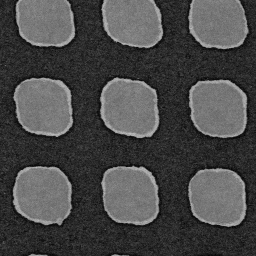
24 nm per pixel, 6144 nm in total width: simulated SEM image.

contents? raised bodies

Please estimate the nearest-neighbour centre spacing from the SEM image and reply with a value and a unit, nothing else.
2.09 microns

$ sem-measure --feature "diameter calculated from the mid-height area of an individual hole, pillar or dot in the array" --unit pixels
58.1